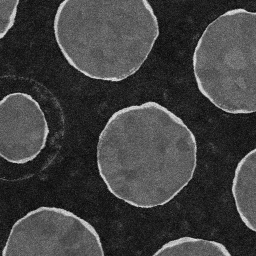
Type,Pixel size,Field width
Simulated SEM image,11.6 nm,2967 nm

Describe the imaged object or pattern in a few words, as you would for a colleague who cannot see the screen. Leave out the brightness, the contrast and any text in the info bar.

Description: raised bodies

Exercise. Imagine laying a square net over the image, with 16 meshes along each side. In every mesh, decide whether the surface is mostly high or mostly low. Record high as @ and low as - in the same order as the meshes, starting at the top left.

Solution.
@---@@@@@-------
@---@@@@@@---@@@
----@@@@@@---@@@
----@@@@@---@@@@
-----@@@----@@@@
-------------@@@
@@-----------@@@
@@@----@@@@-----
@@@---@@@@@@----
@@----@@@@@@----
------@@@@@@---@
-------@@@@@---@
--------@@-----@
--@@@----------@
-@@@@@----------
@@@@@@----@@@@--